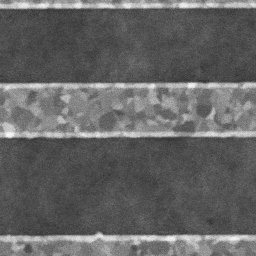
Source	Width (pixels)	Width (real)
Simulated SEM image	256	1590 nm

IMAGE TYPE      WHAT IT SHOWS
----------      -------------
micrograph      one or a few lines or trenches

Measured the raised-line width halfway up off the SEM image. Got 309 nanometres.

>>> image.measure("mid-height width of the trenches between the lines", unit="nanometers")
557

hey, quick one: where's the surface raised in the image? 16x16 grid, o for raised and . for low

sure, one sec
................
................
................
................
................
oooooooooooooooo
oooooooooooooooo
oooooooooooooooo
.o..............
................
................
................
................
................
................
oooooooooooooooo